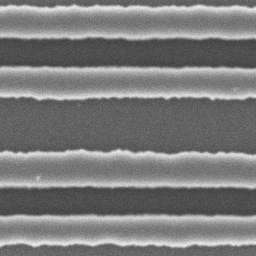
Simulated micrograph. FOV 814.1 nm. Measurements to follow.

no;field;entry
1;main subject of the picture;lines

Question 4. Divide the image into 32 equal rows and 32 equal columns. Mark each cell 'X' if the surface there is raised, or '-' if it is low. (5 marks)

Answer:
--------------------------------
XXXXXXXXXXXXXXXXXXXXXXXXXXXXXXXX
XXXXXXXXXXXXXXXXXXXXXXXXXXXXXXXX
XXXXXXXXXXXXXXXXXXXXXXXXXXXXXXXX
XXXXXXXXXXXXXXXXXXXXXXXXXXXXXXXX
--------------------------------
--------------------------------
--------------------------------
X-XX-X--------------------------
XXXXXXXXXXXXXXXXXXXXXXXXXXXXXXXX
XXXXXXXXXXXXXXXXXXXXXXXXXXXXXXXX
XXXXXXXXXXXXXXXXXXXXXXXXXXXXXXXX
--------------------------------
--------------------------------
--------------------------------
--------------------------------
--------------------------------
--------------------------------
--------------------------------
XXXXXXXXXXXXXXXXXXXXXXXXXXXXXXXX
XXXXXXXXXXXXXXXXXXXXXXXXXXXXXXXX
XXXXXXXXXXXXXXXXXXXXXXXXXXXXXXXX
XXXXXXXXXXXXXXXXXXXXXXXXXXXXXXXX
--------------------------------
--------------------------------
--------------------------------
--------------------------------
XXXXXXXXXXXXXXXXXXXXXXXXXXXXXXXX
XXXXXXXXXXXXXXXXXXXXXXXXXXXXXXXX
XXXXXXXXXXXXXXXXXXXXXXXXXXXXXXXX
X---X-XXX--X---X-XXXXXXX-XXX-XX-
--------------------------------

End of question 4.